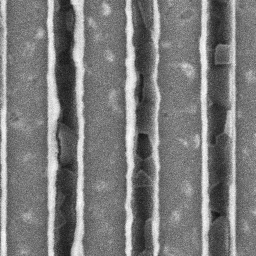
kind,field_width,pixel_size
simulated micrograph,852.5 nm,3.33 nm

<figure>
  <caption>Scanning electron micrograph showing one or a few lines or trenches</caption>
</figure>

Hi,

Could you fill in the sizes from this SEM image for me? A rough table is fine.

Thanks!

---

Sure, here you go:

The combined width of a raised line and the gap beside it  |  254 nanometres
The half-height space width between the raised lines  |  146 nm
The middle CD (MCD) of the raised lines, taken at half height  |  108 nanometers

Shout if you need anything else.